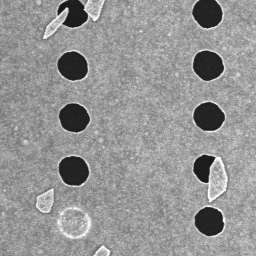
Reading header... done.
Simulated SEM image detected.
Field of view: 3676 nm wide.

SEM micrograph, holes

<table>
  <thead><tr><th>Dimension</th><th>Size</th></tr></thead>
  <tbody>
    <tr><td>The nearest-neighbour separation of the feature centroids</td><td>746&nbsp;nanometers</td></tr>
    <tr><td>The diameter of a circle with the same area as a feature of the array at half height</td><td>0.428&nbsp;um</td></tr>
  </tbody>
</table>